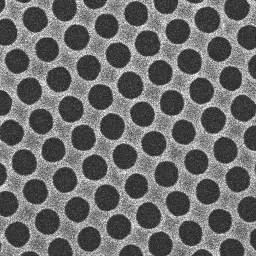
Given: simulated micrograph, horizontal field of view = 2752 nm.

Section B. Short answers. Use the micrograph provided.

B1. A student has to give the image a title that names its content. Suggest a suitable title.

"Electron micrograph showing a regular array of holes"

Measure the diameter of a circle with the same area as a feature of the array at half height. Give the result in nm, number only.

274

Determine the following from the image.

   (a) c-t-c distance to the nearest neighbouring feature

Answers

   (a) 339 nm